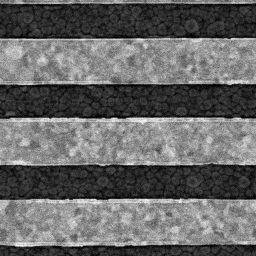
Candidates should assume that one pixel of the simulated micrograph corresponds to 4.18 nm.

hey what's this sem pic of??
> one or a few lines or trenches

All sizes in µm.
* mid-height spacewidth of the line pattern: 0.143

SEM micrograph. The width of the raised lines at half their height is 190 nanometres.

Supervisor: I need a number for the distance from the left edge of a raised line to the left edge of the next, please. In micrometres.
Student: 0.336